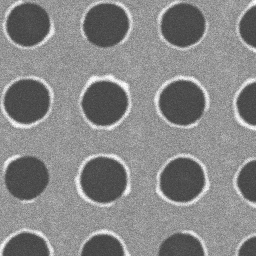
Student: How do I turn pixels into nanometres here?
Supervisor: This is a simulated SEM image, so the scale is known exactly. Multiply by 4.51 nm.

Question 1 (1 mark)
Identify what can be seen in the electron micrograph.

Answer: a regular array of holes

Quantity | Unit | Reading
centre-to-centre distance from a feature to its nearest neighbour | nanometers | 347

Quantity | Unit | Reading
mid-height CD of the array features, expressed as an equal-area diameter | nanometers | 205